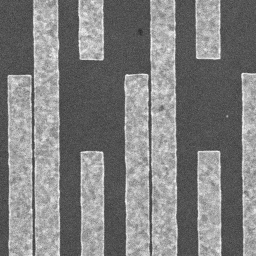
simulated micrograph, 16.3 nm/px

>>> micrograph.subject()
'wiring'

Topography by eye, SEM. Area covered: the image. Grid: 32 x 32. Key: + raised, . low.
....+++...+++......+++...++.....
....+++...+++......+++...++.....
....+++...+++......+++...++.....
....+++...+++......+++...++.....
....+++...+++......+++...++.....
....+++...+++......+++...++.....
....+++...+++......+++...++.....
....+++............+++..........
....+++............+++..........
.++++++.........++.+++........++
.++++++.........++++++........++
.++++++.........++++++........++
.++++++.........++++++........++
.++++++.........++++++........++
.++++++.........++++++........++
.++++++.........++.+++........++
.++++++.........++++++........++
.++++++.........++++++........++
.++++++.........++++++........++
.++++++...+++...++++++...++...++
.++++++...+++...++++++...++...++
.++++++...+++...++++++...++...++
.++++++...+++...++.+++...++...++
.++++++...+++...++++++...+++..++
.++++++...+++...++++++...+++..++
.++++++...+++...++++++...+++..++
.++++++...+++...++++++...+++..++
.++++++...+++...++++++...+++..++
.++++++...+++...++++++...+++..++
.++++++...+++...++++++...+++...+
.+++.++...+++...++++++...+++...+
.++++++...+++...++++++...+++...+